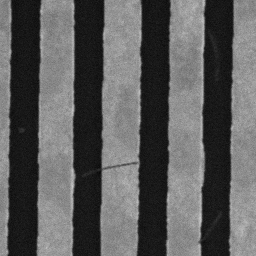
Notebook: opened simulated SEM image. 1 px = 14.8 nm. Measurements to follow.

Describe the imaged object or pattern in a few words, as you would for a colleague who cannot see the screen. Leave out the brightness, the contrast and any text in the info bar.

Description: lines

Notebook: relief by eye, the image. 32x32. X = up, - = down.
X----XXXX----XXXXX---XXXXX---XXX
X----XXXX----XXXXX---XXXX----XXX
X----XXXX----XXXXX---XXXX----XXX
X----XXXX----XXXXX---XXXX----XXX
X----XXXX----XXXXX---XXXX----XXX
X----XXXX----XXXXX---XXXX----XXX
X----XXXX----XXXX----XXXX----XXX
X----XXXX----XXXXX---XXXX----XXX
X----XXXX----XXXXX---XXXX----XXX
X----XXXX----XXXXX---XXXX----XXX
X----XXXX----XXXX----XXXX----XXX
X----XXXX----XXXX----XXXX----XXX
X----XXXX----XXXX----XXXX----XXX
X----XXXX----XXXX----XXXX----XXX
X----XXXX----XXXX----XXXX----XXX
X----XXXX----XXXX----XXXX----XXX
X----XXXX----XXXX----XXXX----XXX
X----XXXX----XXXX----XXXX----XXX
X----XXXX----XXXX----XXXX----XXX
X----XXXX----XXXX----XXXX----XXX
X----XXXX----XXXX----XXXX----XXX
X----XXXX----XXXX----XXXX----XXX
X----XXXX----XXXX----XXXX----XXX
X----XXXX----XXXX----XXXX----XXX
X----XXXX----XXXX----XXXX----XXX
X----XXXX----XXXX----XXXX----XXX
X----XXXX----XXXX----XXXX----XXX
X----XXXX----XXXX----XXXX----XXX
X----XXXX----XXXX----XXXX----XXX
X----XXXX----XXXX----XXXX----XXX
X----XXXX----XXXX----XXXX----XXX
X----XXXX----XXXX----XXXX----XXX